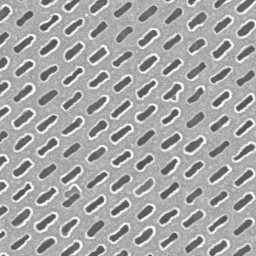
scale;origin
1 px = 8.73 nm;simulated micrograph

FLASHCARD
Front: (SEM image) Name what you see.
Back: a regular array of holes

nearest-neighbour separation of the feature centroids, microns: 0.209